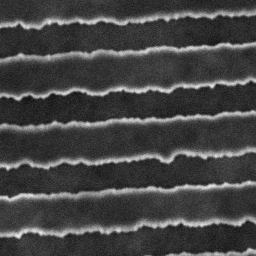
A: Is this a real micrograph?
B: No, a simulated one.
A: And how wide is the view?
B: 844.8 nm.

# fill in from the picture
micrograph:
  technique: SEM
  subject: lines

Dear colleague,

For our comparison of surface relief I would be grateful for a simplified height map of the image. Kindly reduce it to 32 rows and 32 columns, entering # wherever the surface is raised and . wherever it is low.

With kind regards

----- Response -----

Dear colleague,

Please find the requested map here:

################################
################################
###################.............
................................
................................
............................#..#
............##.#################
################################
################################
################################
###########################.##..
#########..###..................
................................
................................
........................##.#####
......##.#######################
################################
################################
################################
######################...###....
###.###....#....................
................................
................................
...................#..##########
..##############################
################################
################################
################################
#################...............
#...............................
................................
...............................#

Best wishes